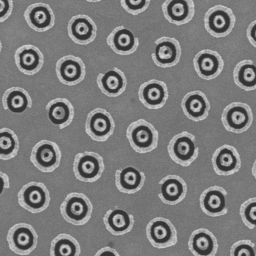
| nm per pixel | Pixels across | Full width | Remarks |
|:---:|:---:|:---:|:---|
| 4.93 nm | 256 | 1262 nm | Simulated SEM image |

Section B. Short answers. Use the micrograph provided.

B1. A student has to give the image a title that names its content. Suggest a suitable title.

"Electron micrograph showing a regular array of ring-shaped grooves with a dot in the middle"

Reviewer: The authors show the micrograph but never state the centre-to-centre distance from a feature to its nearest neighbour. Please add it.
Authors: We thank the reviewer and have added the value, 212 nm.